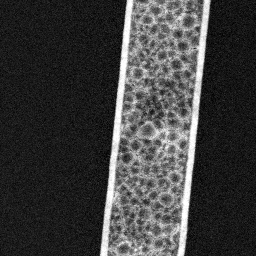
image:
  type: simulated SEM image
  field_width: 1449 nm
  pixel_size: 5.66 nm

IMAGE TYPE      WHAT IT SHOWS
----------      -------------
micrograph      one or a few lines or trenches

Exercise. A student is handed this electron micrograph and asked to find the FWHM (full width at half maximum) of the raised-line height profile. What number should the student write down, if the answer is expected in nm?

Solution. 429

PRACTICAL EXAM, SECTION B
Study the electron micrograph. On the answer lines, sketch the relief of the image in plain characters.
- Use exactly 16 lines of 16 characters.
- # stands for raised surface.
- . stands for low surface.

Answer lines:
........#####...
........#####...
........#####...
........#####...
........####....
........####....
.......#####....
.......#####....
.......#####....
.......#####....
.......#####....
.......#####....
.......#####....
.......#####....
.......####.....
......#####.....